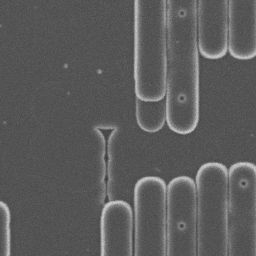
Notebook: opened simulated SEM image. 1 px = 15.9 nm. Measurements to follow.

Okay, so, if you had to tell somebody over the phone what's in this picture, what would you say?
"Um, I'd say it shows wiring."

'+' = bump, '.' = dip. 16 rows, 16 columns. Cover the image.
........++++++++
........++++++++
........++++++++
........++++++.+
........++++....
.........+++....
..........++....
..........++....
................
................
.............+++
.........+++++++
........++++++++
+.....++++++++++
+.....++++++++++
+.....++++++++++